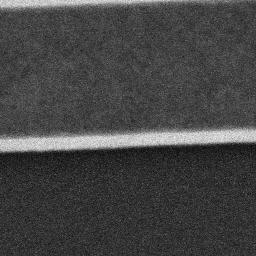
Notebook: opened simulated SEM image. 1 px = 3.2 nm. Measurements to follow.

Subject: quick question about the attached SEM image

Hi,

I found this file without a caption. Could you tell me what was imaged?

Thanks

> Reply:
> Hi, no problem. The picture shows one or a few lines or trenches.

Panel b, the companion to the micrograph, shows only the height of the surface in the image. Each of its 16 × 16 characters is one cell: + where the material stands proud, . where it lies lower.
++++++++++++++++
++++++++++++++++
++++++++++++++++
++++++++++++++++
++++++++++++++++
++++++++++++++++
++++++++++++++++
++++++++++++++++
+++++++++++++++.
................
................
................
................
................
................
................